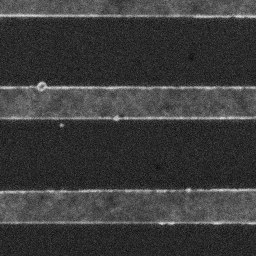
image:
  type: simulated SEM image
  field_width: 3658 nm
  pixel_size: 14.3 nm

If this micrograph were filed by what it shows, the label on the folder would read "lines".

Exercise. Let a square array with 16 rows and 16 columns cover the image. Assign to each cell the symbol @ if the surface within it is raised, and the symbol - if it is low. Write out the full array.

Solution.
@@@@@@@@@@@@@@@@
----------------
----------------
----------------
----------------
@@@@@@@@@@@@@@@@
@@@@@@@@@@@@@@@@
----------------
----------------
----------------
----------------
----------------
@@@@@@@@@@@@@@@@
@@@@@@@@@@@@@@@@
----------------
----------------